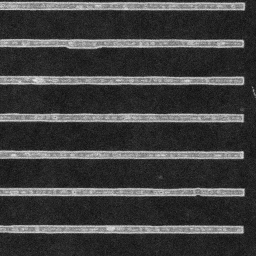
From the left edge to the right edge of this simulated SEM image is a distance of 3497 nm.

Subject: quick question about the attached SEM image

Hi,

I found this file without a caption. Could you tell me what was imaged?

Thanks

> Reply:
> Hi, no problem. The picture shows parallel lines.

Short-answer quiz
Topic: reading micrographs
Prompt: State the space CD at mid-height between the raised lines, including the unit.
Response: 415 nanometers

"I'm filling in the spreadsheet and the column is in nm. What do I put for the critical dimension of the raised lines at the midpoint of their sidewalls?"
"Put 83.6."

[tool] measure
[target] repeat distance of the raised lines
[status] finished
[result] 508 nm